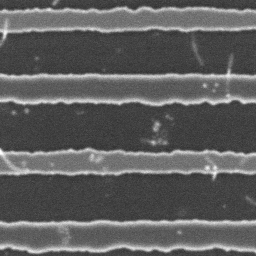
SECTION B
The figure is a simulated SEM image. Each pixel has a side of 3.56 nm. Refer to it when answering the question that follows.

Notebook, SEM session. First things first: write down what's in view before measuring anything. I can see lines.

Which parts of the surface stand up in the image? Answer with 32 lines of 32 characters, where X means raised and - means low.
--------------------------------
XXXXXXXXXXXXXXXXXXXXXXXXXXXXXXXX
XXXXXXXXXXXXXXXXXXXXXXXXXXXXXXXX
XXXXXXXXXXXXXXXXXXXXXXXXXXXXXXXX
--------------------------------
--------------------------------
--------------------------------
--------------------------------
--------------------------------
XXXXXXXXXXXXXXXXXXXXXXXXXXXXXXXX
XXXXXXXXXXXXXXXXXXXXXXXXXXXXXXXX
XXXXXXXXXXXXXXXXXXXXXXXXXXXXXXXX
XXXXXXXXXXXXXXXXXXXXXXXXXXXXXXXX
--------------------------------
--------------------------------
--------------------------------
--------------------------------
--------------------------------
--------------------------------
XXXXXXXXXXXXXXXXXXXXXXXXXXXXXXXX
XXXXXXXXXXXXXXXXXXXXXXXXXXXXXXXX
XXXXXXXXXXXXXXXXXXXXXXXX-XXXX-XX
--------------------------------
--------------------------------
--------------------------------
--------------------------------
--------------------------------
--------------------------------
XXXXXXXXXXXXXXXXXXXXXXXXXXXXXXXX
XXXXXXXXXXXXXXXXXXXXXXXXXXXXXXXX
XXXXXXXXXXXXXXXXXXXXXXXXXXXXXXXX
----X---------------------------